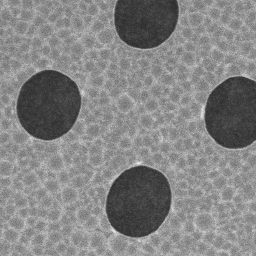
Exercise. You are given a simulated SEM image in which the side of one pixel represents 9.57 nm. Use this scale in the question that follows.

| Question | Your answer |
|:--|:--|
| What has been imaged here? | holes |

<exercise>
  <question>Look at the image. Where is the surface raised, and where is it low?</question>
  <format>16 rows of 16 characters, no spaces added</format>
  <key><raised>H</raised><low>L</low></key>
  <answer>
HHHHHHHLLLLHHHHH
HHHHHHHLLLLHHHHH
HHHHHHHHLLHHHHHH
HHHHHHHHHHHHHHHH
HHLLHHHHHHHHHHHH
HLLLLHHHHHHHHLLL
HLLLLHHHHHHHHLLL
HLLLLHHHHHHHHLLL
HHLLHHHHHHHHHLLL
HHHHHHHHHHHHHHHH
HHHHHHHHLHHHHHHH
HHHHHHHLLLLHHHHH
HHHHHHHLLLLHHHHH
HHHHHHHLLLHHHHHH
HHHHHHHLLLHHHHHH
HHHHHHHHHHHHHHHH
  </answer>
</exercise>